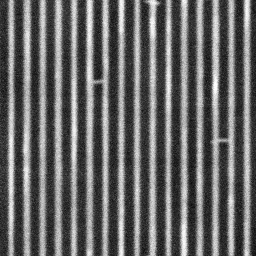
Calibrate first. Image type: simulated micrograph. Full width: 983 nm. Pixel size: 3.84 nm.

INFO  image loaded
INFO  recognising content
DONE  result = parallel lines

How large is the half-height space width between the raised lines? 43.2 nanometers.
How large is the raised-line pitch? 60.4 nm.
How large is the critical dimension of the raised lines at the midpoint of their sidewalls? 18.2 nanometres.